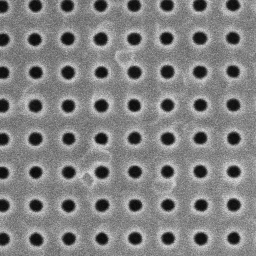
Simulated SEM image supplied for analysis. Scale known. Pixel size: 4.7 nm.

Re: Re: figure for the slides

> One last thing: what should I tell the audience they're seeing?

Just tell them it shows a regular array of holes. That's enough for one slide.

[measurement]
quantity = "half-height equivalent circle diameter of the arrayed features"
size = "12.9 pixels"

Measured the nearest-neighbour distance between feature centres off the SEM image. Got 0.153 microns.